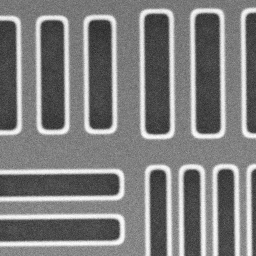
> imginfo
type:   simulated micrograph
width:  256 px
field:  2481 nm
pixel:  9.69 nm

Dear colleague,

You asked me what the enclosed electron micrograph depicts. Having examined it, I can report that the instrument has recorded groups of lines, slits or small figures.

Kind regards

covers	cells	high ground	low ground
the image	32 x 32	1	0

11111111111111111111111111111111
11111111111111111110011110011110
00111000111000111100011100001100
00111000111000111100011100001100
00111000111000111100011100001100
00111000111000111100011100001100
00111000111000111100011100001100
00111000111000111100011100001100
00111000111000111100011100001100
00111000111000111100011100001100
00111000111000111100011100001100
00111000111000111100011100001100
00111000111000111100011100001100
00111000111000111100011100001100
00111000111000111100011100001100
00111000111000111100011100001110
01111101111111111100011100001110
11111111111111111111111111111111
11111111111111111111111111111111
11111111111111111111111111111111
11111111111111111111111111111111
11111111000000111110011001100110
00000000000000011100011001100010
00000000000000011100011001100010
00000000000000011100011001100010
11111111111111111100011001100010
11111111111111111110011001100010
00000000000000011110011001100010
00000000000000011110011001100010
00000000000000011110011001100010
11111111111111111110011001100010
11111111111111111110011001100010